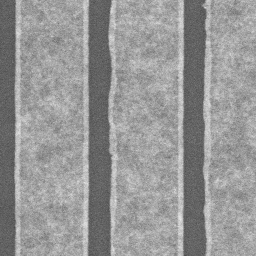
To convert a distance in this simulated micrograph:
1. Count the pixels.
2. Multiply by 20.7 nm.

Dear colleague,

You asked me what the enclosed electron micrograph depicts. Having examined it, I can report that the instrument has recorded one or a few lines or trenches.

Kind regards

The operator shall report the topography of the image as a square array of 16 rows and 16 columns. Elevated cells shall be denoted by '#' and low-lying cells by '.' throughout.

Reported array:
.####..####..###
.####..####..###
.####..####..###
.####..####..###
.####..####..###
.####..####..###
.####..####..###
.####..####..###
.####..####..###
.####..####..###
.####..####..###
.####..####..###
.####..####..###
.####..####..###
.####..####..###
.####..####..###